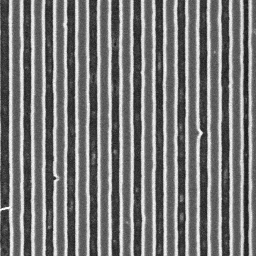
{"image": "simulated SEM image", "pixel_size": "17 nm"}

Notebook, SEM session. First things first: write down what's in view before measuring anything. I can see parallel lines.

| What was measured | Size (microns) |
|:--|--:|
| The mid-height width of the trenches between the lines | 0.168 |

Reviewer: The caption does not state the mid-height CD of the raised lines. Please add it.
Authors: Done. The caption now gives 200 nanometers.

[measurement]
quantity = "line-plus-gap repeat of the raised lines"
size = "374 nanometers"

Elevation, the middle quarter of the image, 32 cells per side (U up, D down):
DDDUUUDDDUUDDDUUUDDDUUUDDUUUDDDU
UDDUUUDDDUUDDDUUUDDDUUUDDUUUDDDU
UDDUUUDDDUUDDDUUUDDDUUDDDUUUDDDU
UDDUUUDDDUUDDDUUUDDDUUDDDUUUDDDU
DDDUUUDDDUUDDDUUUDDDUUDDDUUUDDDU
DDDUUUDDDUUDDDUUUDDDUUDDDUUUDDDU
UDDUUUDDDUUDDDUUUDDDUUDDDUUUDDDU
UDDUUUDDDUUDDDUUUDDDUUDDDUUUDDDU
UDDUUUDDDUUUDDUUUDDDUUDDDUUUDDDU
DDDUUUDDDUUUDDUUUDDDUUUDDUUUDDDU
DDDUUUDDDUUUDDUUUDDDUUUDDUUUDDDU
DDDUUUDDDUUUDDUUUDDDUUUDDUUUDDDU
UDDUUUDDDUUDDDUUUDDDUUUDDUUUDDDU
DDDUUUDDDUUUDDUUUDDDUUDDDUUUDDDU
DDDUUUDDDUUUDDUUUDDDUUDDDUUUDDDU
UDDUUUDDDUUUDDUUUDDDUUDDDUUUDDDU
UDDUUUDDDUUDDDUUUDDDUUDDDUUUDDDU
UDDUUUDDDUUDDDUUUDDDUUDDDUUUDDDU
UDDUUUDDDUUDDDUUUDDDUUDDDUUUDDDU
UDDUUUDDDUUDDDUUUDDDUUDDDUUUDDDU
UDDUUUDDDUUDDDUUUDDDUUUDDUUUDDDU
UDDUUUDDDUUDDDUUUDDDUUUDDUUUDDDU
DDDUUUDDDUUDDDUUUDDDUUUDDUUUDDDU
DDDUUUDDDUUUDDUUUDDDUUUDDUUUDDDU
DDDUUUDDDUUDDDUUUDDDUUUDDUUUDDDU
DDDUUUDDDUUDDDUUUDDDUUUDDUUUDDDU
DDDUUUDDDUUUDDUUUDDDUUDDDUUUDDDU
DDDUUUDDDUUUDDUUUDDDUUDDDUUUDDDU
DDDUUUDDDUUUDDUUUDDDUUDDDUUUDDDU
DDDUUUDDDUUDDDUUUDDDUUDDDUUUDDDU
DDDUUUDDDUUUDDUUUDDDUUDDDUUUDDDU
DDDUUUDDDUUUDDUUUDDDUUDDDUUUDDDU